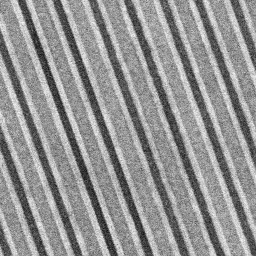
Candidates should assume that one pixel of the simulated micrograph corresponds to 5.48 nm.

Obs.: parallel lines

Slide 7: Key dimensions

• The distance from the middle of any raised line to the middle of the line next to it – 16.6 px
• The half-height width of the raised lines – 26.4 nanometers